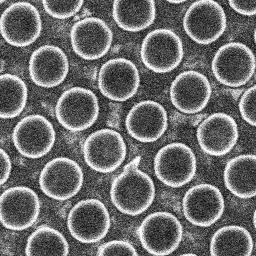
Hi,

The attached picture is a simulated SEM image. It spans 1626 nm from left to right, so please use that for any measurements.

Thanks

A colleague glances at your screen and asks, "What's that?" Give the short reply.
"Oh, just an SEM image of a regular array of raised bodies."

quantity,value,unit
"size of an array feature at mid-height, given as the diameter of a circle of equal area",0.262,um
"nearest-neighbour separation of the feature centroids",318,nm